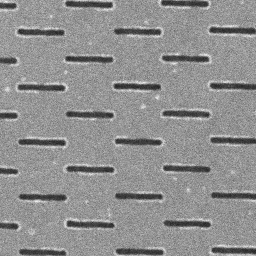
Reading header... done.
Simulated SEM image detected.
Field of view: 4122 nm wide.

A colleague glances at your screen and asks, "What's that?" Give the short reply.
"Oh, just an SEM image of a regular array of holes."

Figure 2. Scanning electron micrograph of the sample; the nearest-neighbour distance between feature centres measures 882 nm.